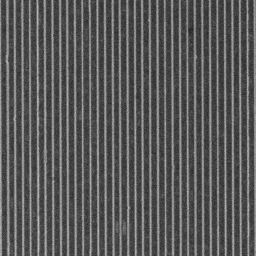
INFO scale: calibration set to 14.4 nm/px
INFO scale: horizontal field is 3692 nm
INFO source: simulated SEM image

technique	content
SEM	parallel lines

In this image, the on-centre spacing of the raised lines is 108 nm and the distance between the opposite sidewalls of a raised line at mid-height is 25.2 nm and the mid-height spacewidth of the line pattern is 84.7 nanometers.